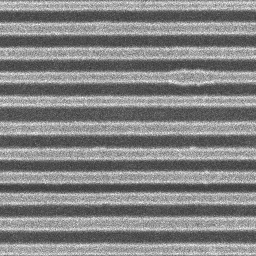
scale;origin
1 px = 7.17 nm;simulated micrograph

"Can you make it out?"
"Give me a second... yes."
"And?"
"parallel lines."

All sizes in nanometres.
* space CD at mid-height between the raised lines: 87.8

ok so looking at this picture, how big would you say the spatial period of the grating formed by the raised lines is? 174 nm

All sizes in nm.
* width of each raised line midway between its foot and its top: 87.8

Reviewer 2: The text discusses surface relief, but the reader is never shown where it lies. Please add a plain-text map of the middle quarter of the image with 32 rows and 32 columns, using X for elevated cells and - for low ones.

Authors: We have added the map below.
--------------------------------
-----------------------------XX-
XXXXXXXXXXXXXXXXXXXXXXXXXXXXXXXX
XXXXXXXXXXXXXXXXXXXXXXXXXXXXXXXX
XXXXXXXXXXXXXXXXXXXXXXXXXXXXXXXX
--------------------------------
--------------------------------
--------------------------------
XXXXXXXXXXXXXXXXXXXXXXXXXXXXXXXX
XXXXXXXXXXXXXXXXXXXXXXXXXXXXXXXX
--------------------------------
--------------------------------
--------------------------------
--------------------------------
--X-----------------------------
XXXXXXXXXXXXXXXXXXXXXXXXXXXXXXXX
XXXXXXXXXXXXXXXXXXXXXXXXXXXXXXXX
XXXXXXXXXXXXXXXXXXXXXXXXXXXXXXXX
--------------------------------
--------------------------------
--------------------------------
XXXXXXXXXXXXXXXXXXXXXXXXXXXXXXXX
XXXXXXXXXXXXXXXXXXXXXXXXXXXXXXXX
XXXXXXXXXXXXXXXXXXXXXXXXXXXXXXXX
--------------------------------
--------------------------------
--------------------------------
XXXXXXXXXXXXXXXXXXXXXXXXXXXXXXXX
XXXXXXXXXXXXXXXXXXXXXXXXXXXXXXXX
XXXXXXXXXXXXXXXXXXXXXXXXXXXXXXXX
--------------------------------
--------------------------------